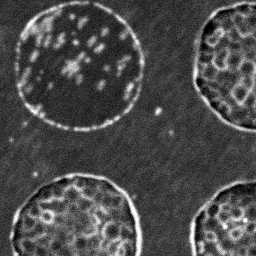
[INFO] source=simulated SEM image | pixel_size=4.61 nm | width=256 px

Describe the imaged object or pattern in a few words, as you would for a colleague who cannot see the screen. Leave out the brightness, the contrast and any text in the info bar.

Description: holes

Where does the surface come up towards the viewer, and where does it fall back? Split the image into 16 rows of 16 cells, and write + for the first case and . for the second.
++++++++++++++..
+++++++++++++...
+++++++++++++...
++++++++++++....
++++++++++++....
++++++++++++....
+++++++++++++...
++++++++++++++..
++++++++++++++++
++++++++++++++++
++++++++++++++++
+++....++++++++.
++......+++++...
+.......++++....
+........+++....
+........+++....